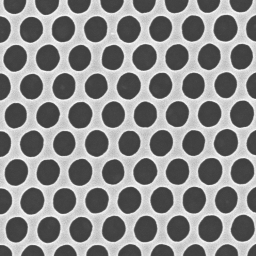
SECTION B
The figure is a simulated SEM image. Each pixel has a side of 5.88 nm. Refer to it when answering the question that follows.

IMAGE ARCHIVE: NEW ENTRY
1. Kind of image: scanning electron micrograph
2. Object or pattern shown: a regular array of holes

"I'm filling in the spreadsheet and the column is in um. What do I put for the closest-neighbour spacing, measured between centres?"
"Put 0.189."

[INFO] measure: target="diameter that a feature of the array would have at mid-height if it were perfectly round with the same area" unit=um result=0.146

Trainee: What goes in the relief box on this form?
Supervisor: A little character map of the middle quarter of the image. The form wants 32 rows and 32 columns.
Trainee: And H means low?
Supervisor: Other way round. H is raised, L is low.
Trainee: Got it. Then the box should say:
HLLLLLHHHHLLLLHHHHLLLLHHHHLLLLHH
HHHLLHHHHHHHLHHHHHHLLHHHHHHLLHHH
LHHHHHHLLHHHHHHLLLHHHHHLLLHHHHHL
LLLHHHLLLLHHHHLLLLLHHHLLLLLHHHLL
LLLHHLLLLLLHHLLLLLLHHHLLLLLHHHLL
LLLHHLLLLLLHHLLLLLLHHLLLLLLHHLLL
LLLHHLLLLLLHHLLLLLLHHLLLLLLHHHLL
LLHHHHLLLLHHHHLLLLLHHHLLLLHHHHLL
LHHHHHHLLHHHHHHLLLHHHHHLLHHHHHHL
HHHHLHHHHHHLLHHHHHHLLHHHHHHHLLHH
HHLLLLHHHHLLLLLHHHLLLLLHHHLLLLLH
HLLLLLLHHHLLLLLHHHLLLLLHHHLLLLLH
HLLLLLLHHLLLLLLHHLLLLLLHHLLLLLLH
HLLLLLLHHHLLLLLHHLLLLLLHHHLLLLLH
HLLLLLLHHHLLLLLHHHLLLLLHHHLLLLLH
HHLLLLHHHHHLLLHHHHHLLLHHHHHLLLHH
HHHHHHHLLHHHHHHHHHHHHHHHLHHHHHHH
LLHHHHLLLLHHHHHLLLHHHHLLLLLHHHHL
LLLHHLLLLLLHHHLLLLLHHHLLLLLHHHLL
LLLHHLLLLLLHHHLLLLLHHLLLLLLHHHLL
LLLHHLLLLLLHHHLLLLLHHLLLLLLHHHLL
LLHHHHLLLLLHHHLLLLLHHHLLLLLHHHLL
LLHHHHLLLLHHHHHLLLHHHHLLLLHHHHHL
HHHHLHHHHHHHHHHHHHHHLHHHHHHHHHHH
HHLLLLHHHHHLLLHHHHLLLLLHHHLLLLLH
HHLLLLLHHHLLLLLHHHLLLLLHHHLLLLLH
HLLLLLLHHLLLLLLHHLLLLLLHHLLLLLLH
HLLLLLLHHLLLLLLHHLLLLLLHHLLLLLLH
HLLLLLLHHHLLLLLHHHLLLLLHHHLLLLLH
HHLLLLHHHHLLLLHHHHLLLLHHHHHLLLHH
HHHLLHHHHHHHHHHHHHHHHHHHHHHHHHHH
LLHHHHHLLLHHHHHLLLHHHHHLLLLHHHHL